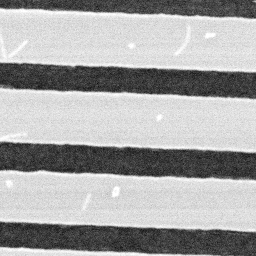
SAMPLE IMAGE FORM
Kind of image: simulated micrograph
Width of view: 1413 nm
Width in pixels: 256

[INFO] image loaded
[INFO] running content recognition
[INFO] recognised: lines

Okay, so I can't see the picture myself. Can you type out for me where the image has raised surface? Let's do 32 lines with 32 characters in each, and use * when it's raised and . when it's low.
................................
**********......................
********************************
********************************
********************************
********************************
********************************
********************************
...................*************
................................
................................
***********.....................
********************************
********************************
********************************
********************************
********************************
********************************
....................************
................................
................................
***.***.........................
*****************************...
********************************
********************************
********************************
********************************
********************************
.......................*********
................................
................................
***********.....................